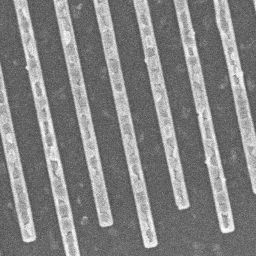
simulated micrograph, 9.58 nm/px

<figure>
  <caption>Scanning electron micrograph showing parallel lines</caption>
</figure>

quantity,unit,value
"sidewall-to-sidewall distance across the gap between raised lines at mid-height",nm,257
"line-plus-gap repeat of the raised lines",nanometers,376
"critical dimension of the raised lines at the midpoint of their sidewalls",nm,120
